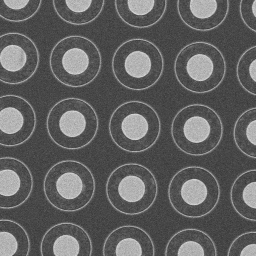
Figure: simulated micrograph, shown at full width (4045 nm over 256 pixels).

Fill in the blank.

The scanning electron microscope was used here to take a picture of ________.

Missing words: an array of small figures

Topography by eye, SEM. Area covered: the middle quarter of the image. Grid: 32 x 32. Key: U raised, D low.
UUUUUUDDDUUUDDDUUUUUUDDDDUUUDDDU
UUUUUDDDDUUUDDDDUUUUUDDDUUUUDDDU
DDUDDDDDUUUUUDDDUUUUUDDDUUUUDDDU
DDDDDDDUUUUUUDDDDDDDDDDDUUUUDDDD
DDDDDDUUUUUUUUDDDDDDDDDUUUUUUDDD
UUDDUUUUUUUUUUUDDDDDDUUUUUUUUUDD
UUUUUUUUUUUUUUUUUUUUUUUUUUUUUUUD
UUUUUUUUUUUUUUUUUUUUUUUUUUUUUUUU
UUUUUUUUUUUUUUUUUUUUUUUUUUUUUUUU
DDDDDUUUUUUUUUUUUDUUUUUUUUUUUUUU
DDDDDDUUUUUUUUDDDDDDDUUUUUUUUUUU
DDDDDDDUUUUUUDDDDDDDDDUUUUUUUDDD
UUUUDDDDUUUUDDDDDDDDDDDUUUUUUDDD
UUUUUDDDUUUUDDDUUUUUDDDDUUUUDDDD
UUUUUDDDUUUUDDDUUUUUUDDDUUUDDDDU
UUUUUDDDUUUDDDDUUUUUUDDDUUUDDDUU
UUUUUDDDUUUUDDDUUUUUUDDDUUUDDDUU
UUUUDDDDUUUUDDDUUUUUDDDDUUUDDDUU
DDDDDDDUUUUUDDDDUUUDDDDUUUUDDDDU
DDDDDDUUUUUUUDDDDDDDDDDUUUUUDDDD
DDDDDUUUUUUUUUDDDDDDDDUUUUUUUDDD
UUUUUUUUUUUUUUUUDDDDUUUUUUUUUUDD
UUUUUUUUUUUUUUUUUUUUUUUUUUUUUUUU
UUUUUUUUUUUUUUUUUUUUUUUUUUUUUUUU
DDDUUUUUUUUUUUUUUUUUUUUUUUUUUUUU
DDDDDUUUUUUUUUUDDDDUUUUUUUUUUUUU
DDDDDDUUUUUUUDDDDDDDDUUUUUUUUUDD
UUUDDDDUUUUUDDDDDDDDDDUUUUUUDDDD
UUUUDDDUUUUDDDDUUUDDDDUUUUUDDDDD
UUUUDDDUUUUDDDUUUUUUDDDUUUUDDDUU
UUUUDUDDUUUDDDUUUUUUDDDUUUDDDDUU
UUUUUDDUUUUDDDUUUUUUDDDUUUDDDUUU